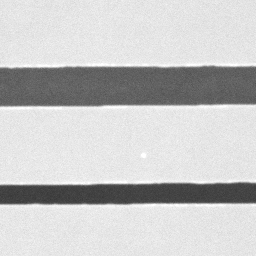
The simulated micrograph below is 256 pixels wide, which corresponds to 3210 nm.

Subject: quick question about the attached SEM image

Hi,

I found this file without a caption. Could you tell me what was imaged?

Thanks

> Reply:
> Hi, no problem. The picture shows lines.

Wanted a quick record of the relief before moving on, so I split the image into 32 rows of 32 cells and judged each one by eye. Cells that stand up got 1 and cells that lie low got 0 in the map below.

11111111111111111111111111111111
11111111111111111111111111111111
11111111111111111111111111111111
11111111111111111111111111111111
11111111111111111111111111111111
11111111111111111111111111111111
11111111111111111111111111111111
11111111111111111111111111111111
00000000000000000000000000000000
00000000000000000000000000000000
00000000000000000000000000000000
00000000000000000000000000000000
00000000000000000000000000000000
11111111111111111111111111111111
11111111111111111111111111111111
11111111111111111111111111111111
11111111111111111111111111111111
11111111111111111111111111111111
11111111111111111111111111111111
11111111111111111111111111111111
11111111111111111111111111111111
11111111111111111111111111111111
11111111111111111111111111111111
00000000000000000000000000000000
00000000000000000000000000000000
00000000000000000000000000000000
11111111111111111111111111111111
11111111111111111111111111111111
11111111111111111111111111111111
11111111111111111111111111111111
11111111111111111111111111111111
11111111111111111111111111111111